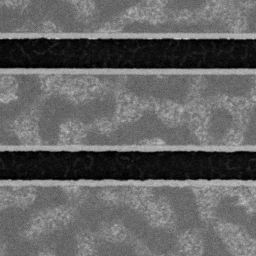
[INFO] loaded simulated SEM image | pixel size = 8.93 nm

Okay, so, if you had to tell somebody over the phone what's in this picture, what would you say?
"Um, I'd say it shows one or a few lines or trenches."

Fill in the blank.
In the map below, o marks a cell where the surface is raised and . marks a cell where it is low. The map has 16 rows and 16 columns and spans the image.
oooooooooooooooo
oooooooooooooooo
................
................
oooooooooo.o.ooo
oooooooooooooooo
oooooooooooooooo
oooooooooooooooo
oooooooooooooooo
................
................
oooooooooooooooo
oooooooooooooooo
oooooooooooooooo
oooooooooooooooo
oooooooooooooooo